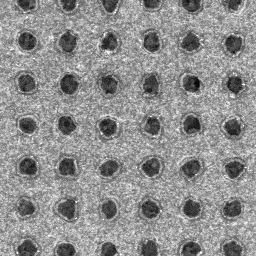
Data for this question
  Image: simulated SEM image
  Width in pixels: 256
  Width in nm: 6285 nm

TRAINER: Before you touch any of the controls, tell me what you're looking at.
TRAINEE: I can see a regular array of raised bodies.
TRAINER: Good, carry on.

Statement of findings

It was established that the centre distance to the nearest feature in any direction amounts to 985 nm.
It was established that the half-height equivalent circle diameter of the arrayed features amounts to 494 nm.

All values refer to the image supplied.